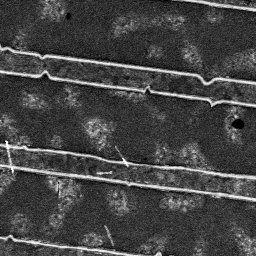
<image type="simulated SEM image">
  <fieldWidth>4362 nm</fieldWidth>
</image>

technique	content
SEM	one or a few lines or trenches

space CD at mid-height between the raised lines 1.24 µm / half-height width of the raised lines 362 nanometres